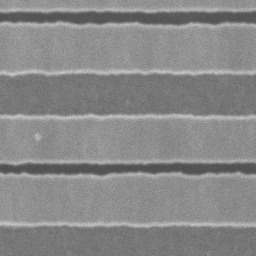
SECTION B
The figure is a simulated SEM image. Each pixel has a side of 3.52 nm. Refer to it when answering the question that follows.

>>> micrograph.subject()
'lines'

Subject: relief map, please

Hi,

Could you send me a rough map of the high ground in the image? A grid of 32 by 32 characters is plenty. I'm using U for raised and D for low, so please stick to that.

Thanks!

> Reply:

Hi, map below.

UUUUUUUUUUUUUUUUUUUUUUUUUUUUUUUU
UUDDDUDDDUDDDDDDDDUUDDDDDDUDDUDD
DDDDDDDDDDDDDDDDDDDDDDDDDDDDDDDD
UUUUUUUUUUUUUUUUUUUUUUUUUUUUUUUU
UUUUUUUUUUUUUUUUUUUUUUUUUUUUUUUU
UUUUUUUUUUUUUUUUUUUUUUUUUUUUUUUU
UUUUUUUUUUUUUUUUUUUUUUUUUUUUUUUU
UUUUUUUUUUUUUUUUUUUUUUUUUUUUUUUU
UUUUUUUUUUUUUUUUUUUUUUUUUUUUUUUU
DDDDDDDDDDDDDDDDDDDDDDDDDDDDDDDD
DDDDDDDDDDDDDDDDDDDDDDDDDDDDDDDD
DDDDDDDDDDDDDDDDDDDDDDDDDDDDDDDD
DDDDDDDDDDDDDDDDDDDDDDDDDDDDDDDD
DDDDDDDDDDDDDDDDDDDDDDDDDDDDDDDD
UUUDDUUDDUUUDUUUUUUUUUUUDDUDDDDU
UUUUUUUUUUUUUUUUUUUUUUUUUUUUUUUU
UUUUUUUUUUUUUUUUUUUUUUUUUUUUUUUU
UUUUUUUUUUUUUUUUUUUUUUUUUUUUUUUU
UUUUUUUUUUUUUUUUUUUUUUUUUUUUUUUU
UUUUUUUUUUUUUUUUUUUUUUUUUUUUUUUU
DUUDDDDDDDDDDDDDDDDDDDDDDDDDDDDD
DDDDDDDDDDDDDDDDDDDDDDDDDDDDDDDD
UUUUUUUUUUUUUUUUUUUUUUUUUUUUUUUU
UUUUUUUUUUUUUUUUUUUUUUUUUUUUUUUU
UUUUUUUUUUUUUUUUUUUUUUUUUUUUUUUU
UUUUUUUUUUUUUUUUUUUUUUUUUUUUUUUU
UUUUUUUUUUUUUUUUUUUUUUUUUUUUUUUU
UUUUUUUUUUUUUUUUUUUUUUUUUUUUUUUU
DDDDDDDDDDDDDDDDDDDDDDDDDDDDDDDD
DDDDDDDDDDDDDDDDDDDDDDDDDDDDDDDD
DDDDDDDDDDDDDDDDDDDDDDDDDDDDDDDD
DDDDDDDDDDDDDDDDDDDDDDDDDDDDDDDD